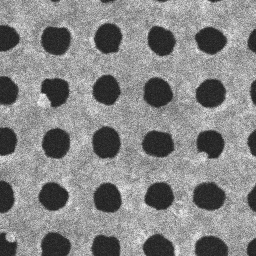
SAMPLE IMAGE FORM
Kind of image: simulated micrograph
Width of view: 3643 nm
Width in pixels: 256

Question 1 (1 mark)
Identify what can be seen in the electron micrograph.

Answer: a regular array of holes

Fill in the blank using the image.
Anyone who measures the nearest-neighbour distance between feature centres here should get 0.72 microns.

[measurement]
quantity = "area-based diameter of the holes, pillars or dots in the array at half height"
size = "417 nm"